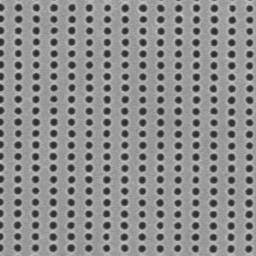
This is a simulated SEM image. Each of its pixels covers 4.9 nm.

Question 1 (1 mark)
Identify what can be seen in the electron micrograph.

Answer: a regular array of holes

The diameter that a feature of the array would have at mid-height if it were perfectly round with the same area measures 36.7 nanometres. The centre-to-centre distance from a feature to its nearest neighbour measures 0.0554 µm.